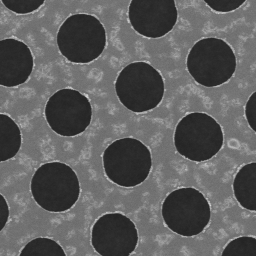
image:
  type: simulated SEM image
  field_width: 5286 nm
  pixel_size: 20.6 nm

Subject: a regular array of holes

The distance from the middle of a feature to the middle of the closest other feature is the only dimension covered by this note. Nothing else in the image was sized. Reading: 1560 nanometers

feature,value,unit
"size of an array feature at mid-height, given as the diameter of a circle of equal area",1010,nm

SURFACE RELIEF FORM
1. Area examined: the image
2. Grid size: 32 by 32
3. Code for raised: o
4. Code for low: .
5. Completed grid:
.....ooooooooooo......oooo....oo
oo..oooooooooooo......oooooooooo
oooooooo....oooo......oooooooooo
ooooooo......oooo.....oooooooooo
ooooooo......ooooo..oooooooooooo
...oooo......ooooooooooo....oooo
....oooo.....ooooooooooo.....ooo
....ooooo...ooooooooooo......ooo
....oooooooooooo...oooo......ooo
....ooooooooooo.....oooo.....ooo
...ooooooooooo......ooooo...oooo
ooooooo...ooooo.....oooooooooooo
oooooo.....oooo.....ooooooooooo.
oooooo.....ooooo...oooooooooooo.
.ooooo.....oooooooooooo...ooooo.
..oooo.....ooooooooooo.....oooo.
...oooo...oooooooooooo......oooo
...oooooooooooo..ooooo......oooo
..ooooooooooo.....oooo......oooo
..ooooooooooo......oooo....ooooo
oooooo..ooooo......oooooooooooo.
oooo.....oooo......ooooooooooo..
oooo......oooo....ooooooooooo...
oooo......ooooooooooooo.ooooo...
oooo......ooooooooooo....oooo...
.oooo....ooooooooooo......oooo..
.ooooooooooooooooooo......oooooo
.ooooooooooo....ooooo.....oooooo
oooooooooooo.....oooo.....oooooo
ooooooooooo......oooooo.oooooooo
ooo....ooooo.....oooooooooooo...
ooo.....oooo....oooooooooooo....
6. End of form